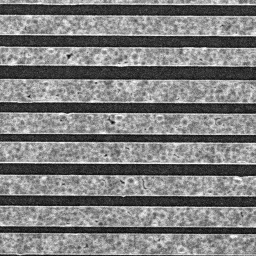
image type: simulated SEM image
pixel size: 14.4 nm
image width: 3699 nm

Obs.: parallel lines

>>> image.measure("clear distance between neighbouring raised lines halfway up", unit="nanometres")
159